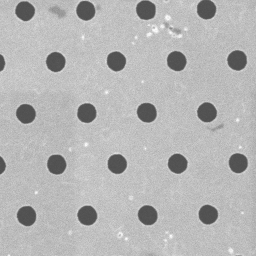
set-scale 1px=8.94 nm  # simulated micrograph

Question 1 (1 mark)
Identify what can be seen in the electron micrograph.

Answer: a regular array of holes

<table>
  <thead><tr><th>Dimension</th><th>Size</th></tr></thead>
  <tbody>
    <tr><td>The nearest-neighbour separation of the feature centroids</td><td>59.3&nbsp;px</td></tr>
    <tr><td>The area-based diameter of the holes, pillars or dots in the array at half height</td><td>176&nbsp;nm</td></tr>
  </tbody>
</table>